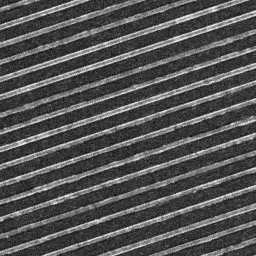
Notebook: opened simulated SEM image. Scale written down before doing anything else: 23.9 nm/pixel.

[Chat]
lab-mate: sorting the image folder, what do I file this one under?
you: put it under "parallel lines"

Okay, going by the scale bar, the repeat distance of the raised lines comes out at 16.6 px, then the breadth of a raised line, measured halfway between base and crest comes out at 0.0939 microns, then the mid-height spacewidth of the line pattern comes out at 0.31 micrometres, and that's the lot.